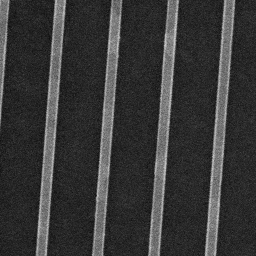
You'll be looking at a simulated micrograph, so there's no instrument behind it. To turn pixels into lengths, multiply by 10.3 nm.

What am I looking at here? parallel lines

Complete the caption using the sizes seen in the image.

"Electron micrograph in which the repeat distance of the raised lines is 56.2 px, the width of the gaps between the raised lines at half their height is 476 nm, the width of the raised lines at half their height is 96.1 nm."